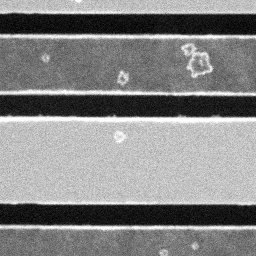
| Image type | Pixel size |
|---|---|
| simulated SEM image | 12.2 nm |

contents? lines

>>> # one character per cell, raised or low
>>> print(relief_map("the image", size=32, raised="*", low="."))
********************************
********************************
................................
................................
********************************
********************************
********************************
********************************
********************************
********************************
********************************
********************************
................................
................................
................................
********************************
********************************
********************************
********************************
********************************
********************************
********************************
********************************
********************************
********************************
.............................***
................................
................................
********************************
********************************
********************************
********************************